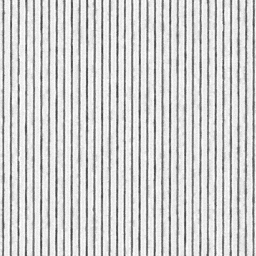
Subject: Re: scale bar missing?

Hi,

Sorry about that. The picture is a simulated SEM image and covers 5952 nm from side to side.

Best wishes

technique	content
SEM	parallel lines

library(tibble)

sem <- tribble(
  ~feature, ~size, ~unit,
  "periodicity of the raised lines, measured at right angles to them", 176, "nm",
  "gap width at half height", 61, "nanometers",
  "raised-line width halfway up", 125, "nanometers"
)